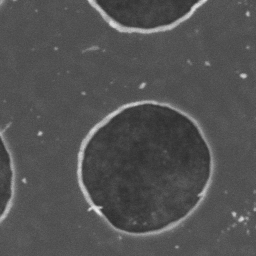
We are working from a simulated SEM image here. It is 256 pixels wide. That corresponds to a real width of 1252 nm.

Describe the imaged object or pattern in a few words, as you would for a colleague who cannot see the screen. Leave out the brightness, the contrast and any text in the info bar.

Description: holes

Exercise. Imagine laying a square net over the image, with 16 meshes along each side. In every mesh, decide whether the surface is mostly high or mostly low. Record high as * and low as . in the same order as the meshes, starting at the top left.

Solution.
******......****
*******....*****
****************
****************
****************
****************
****************
*******.....****
******.......***
*****........***
.****........***
.****........***
.*****......****
*******.....****
********..******
****************